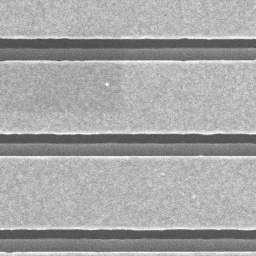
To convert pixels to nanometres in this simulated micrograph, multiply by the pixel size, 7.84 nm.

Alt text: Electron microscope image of lines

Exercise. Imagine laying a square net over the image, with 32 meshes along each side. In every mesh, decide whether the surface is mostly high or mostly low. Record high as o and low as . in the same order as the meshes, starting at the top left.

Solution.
oooooooooooooooooooooooooooooooo
oooooooooooooooooooooooooooooooo
oooooooooooooooooooooooooooooooo
oooooooooooooooooooooooooooooooo
oooooooooooooooooooooooooooooooo
................................
................................
................................
oooooooooooooooooooooooooooooooo
oooooooooooooooooooooooooooooooo
oooooooooooooooooooooooooooooooo
oooooooooooooooooooooooooooooooo
oooooooooooooooooooooooooooooooo
oooooooooooooooooooooooooooooooo
oooooooooooooooooooooooooooooooo
oooooooooooooooooooooooooooooooo
oooooooooooooooooooooooooooooooo
................................
................................
........................oo......
oooooooooooooooooooooooooooooooo
oooooooooooooooooooooooooooooooo
oooooooooooooooooooooooooooooooo
oooooooooooooooooooooooooooooooo
oooooooooooooooooooooooooooooooo
oooooooooooooooooooooooooooooooo
oooooooooooooooooooooooooooooooo
oooooooooooooooooooooooooooooooo
oooooooooooooooooooooooooooooooo
................................
................................
................................